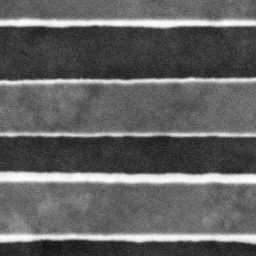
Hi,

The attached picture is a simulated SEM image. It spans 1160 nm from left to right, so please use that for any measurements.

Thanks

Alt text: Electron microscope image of lines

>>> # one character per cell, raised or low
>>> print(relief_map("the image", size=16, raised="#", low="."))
################
..........#.....
................
................
................
################
################
################
................
................
................
################
################
################
################
................